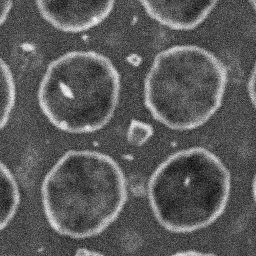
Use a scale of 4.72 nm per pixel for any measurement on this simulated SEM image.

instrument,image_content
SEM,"raised bodies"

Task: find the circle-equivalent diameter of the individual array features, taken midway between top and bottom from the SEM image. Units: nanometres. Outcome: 370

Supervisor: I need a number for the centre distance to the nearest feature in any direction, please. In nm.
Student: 484